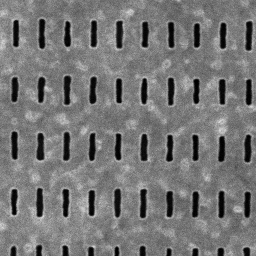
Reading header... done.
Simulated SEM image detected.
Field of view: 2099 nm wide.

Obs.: a regular array of holes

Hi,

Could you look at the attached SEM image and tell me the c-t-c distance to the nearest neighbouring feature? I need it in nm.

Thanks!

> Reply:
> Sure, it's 211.